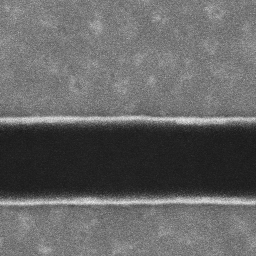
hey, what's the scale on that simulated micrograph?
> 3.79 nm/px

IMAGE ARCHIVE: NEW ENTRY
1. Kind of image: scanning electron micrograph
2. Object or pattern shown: one or a few lines or trenches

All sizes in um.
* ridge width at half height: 0.319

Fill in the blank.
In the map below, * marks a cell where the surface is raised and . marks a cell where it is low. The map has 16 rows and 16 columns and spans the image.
................
................
................
................
................
................
................
****************
****************
****************
****************
****************
****************
................
................
................